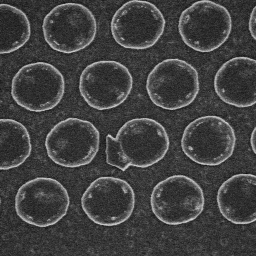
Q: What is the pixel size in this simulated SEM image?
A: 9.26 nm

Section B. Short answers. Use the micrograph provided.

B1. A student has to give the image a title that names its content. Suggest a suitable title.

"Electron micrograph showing a regular array of raised bodies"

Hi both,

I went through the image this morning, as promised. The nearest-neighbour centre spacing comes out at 617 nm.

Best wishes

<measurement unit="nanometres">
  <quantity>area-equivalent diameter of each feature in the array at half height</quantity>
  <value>461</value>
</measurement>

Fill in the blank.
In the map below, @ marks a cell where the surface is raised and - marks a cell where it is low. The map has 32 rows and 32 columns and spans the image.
----------------@@@-----@@@-----
@@@---@@@@@----@@@@@---@@@@@----
@@@---@@@@@@--@@@@@@---@@@@@@--@
@@@@-@@@@@@@--@@@@@@--@@@@@@@--@
@@@@--@@@@@@--@@@@@@---@@@@@----
@@@---@@@@@----@@@@----@@@@@----
@-------@-----------------------
-----------------------------@@@
---@@@@----@@@@@---@@@@@----@@@@
--@@@@@@--@@@@@@---@@@@@@--@@@@@
--@@@@@@--@@@@@@--@@@@@@@--@@@@@
--@@@@@@--@@@@@@---@@@@@@--@@@@@
--@@@@@----@@@@----@@@@@----@@@@
---@@@------@@-------@----------
--------------------------------
@@-----@@@@-----@@@@----@@@@----
@@@---@@@@@@---@@@@@@--@@@@@@---
@@@@--@@@@@@-@@@@@@@@--@@@@@@--@
@@@@--@@@@@@-@@@@@@@@--@@@@@@---
@@@---@@@@@@-@@@@@@@----@@@@@---
@@-----@@@----@@@@@-------@-----
--------------------------------
----@@------@@@------@@@-----@@@
---@@@@@---@@@@@---@@@@@@---@@@@
--@@@@@@--@@@@@@@--@@@@@@--@@@@@
--@@@@@@@-@@@@@@@--@@@@@@--@@@@@
--@@@@@@---@@@@@---@@@@@@---@@@@
---@@@@-----@@@-----@@@@-----@@@
--------------------------------
--------------------------------
--------------------------------
--------------------------------